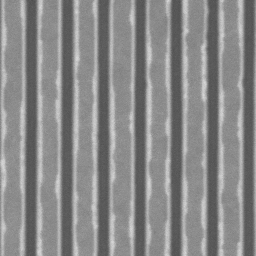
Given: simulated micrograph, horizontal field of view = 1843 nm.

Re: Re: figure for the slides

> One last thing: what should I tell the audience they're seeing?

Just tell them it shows parallel lines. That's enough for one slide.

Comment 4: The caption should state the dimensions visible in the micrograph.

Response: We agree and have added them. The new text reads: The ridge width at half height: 151 nm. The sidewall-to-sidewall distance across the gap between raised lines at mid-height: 109 nm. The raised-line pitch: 262 nanometres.